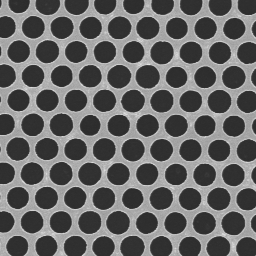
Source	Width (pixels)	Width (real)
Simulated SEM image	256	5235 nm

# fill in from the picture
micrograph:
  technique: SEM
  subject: a regular array of holes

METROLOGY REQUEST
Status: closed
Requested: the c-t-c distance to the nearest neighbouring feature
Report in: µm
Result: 0.575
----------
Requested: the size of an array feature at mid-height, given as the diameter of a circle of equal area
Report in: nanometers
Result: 462